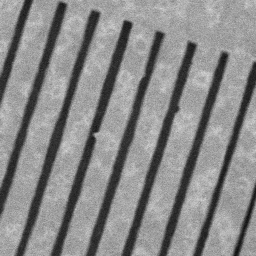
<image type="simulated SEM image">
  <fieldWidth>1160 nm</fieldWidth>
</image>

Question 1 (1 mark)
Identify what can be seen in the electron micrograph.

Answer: parallel lines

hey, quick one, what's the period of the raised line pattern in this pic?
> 154 nanometres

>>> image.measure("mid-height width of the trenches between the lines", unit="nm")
47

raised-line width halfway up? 107 nanometres